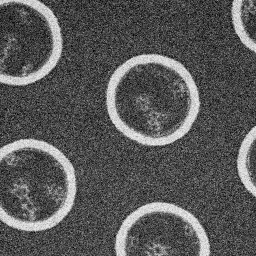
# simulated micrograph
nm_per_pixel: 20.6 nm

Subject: raised bodies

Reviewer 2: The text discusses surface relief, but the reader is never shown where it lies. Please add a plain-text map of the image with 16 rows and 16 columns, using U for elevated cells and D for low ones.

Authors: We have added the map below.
UUUDDDDDDDDDDDDU
UUUDDDDDDDDDDDDU
UUUUDDDDDDDDDDDU
UUUDDDDDDDDDDDDD
UUUDDDDDUUUDDDDD
DDDDDDDUUUUUDDDD
DDDDDDDUUUUUDDDD
DDDDDDDUUUUUDDDD
DDDDDDDDDUUDDDDD
UUUDDDDDDDDDDDDU
UUUUDDDDDDDDDDDU
UUUUDDDDDDDDDDDD
UUUUDDDDDDDDDDDD
UUUUDDDDUUUUDDDD
DDDDDDDDUUUUUDDD
DDDDDDDDUUUUUDDD